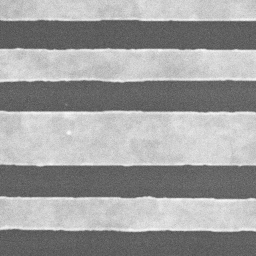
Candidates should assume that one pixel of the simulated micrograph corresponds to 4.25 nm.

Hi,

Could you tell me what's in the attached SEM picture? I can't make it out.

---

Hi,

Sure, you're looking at lines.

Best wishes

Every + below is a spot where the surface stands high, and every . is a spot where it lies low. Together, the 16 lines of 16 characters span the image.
++++++++++++++++
................
................
++++++++++++++++
++++++++++++++++
................
................
++++++++++++++++
++++++++++++++++
++++++++++++++++
................
................
++++++++++++++++
++++++++++++++++
................
................